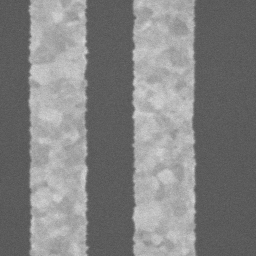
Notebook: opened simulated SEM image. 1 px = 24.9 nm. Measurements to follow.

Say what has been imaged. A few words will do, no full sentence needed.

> one or a few lines or trenches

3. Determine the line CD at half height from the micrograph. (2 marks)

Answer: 1400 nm